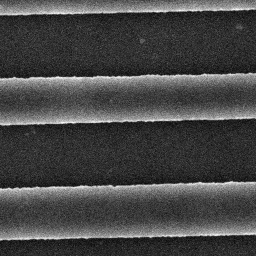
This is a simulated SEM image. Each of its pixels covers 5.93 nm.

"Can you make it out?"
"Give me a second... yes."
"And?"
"lines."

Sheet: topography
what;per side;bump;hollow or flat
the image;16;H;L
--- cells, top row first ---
HHHHHHHHHHHHHHHH
LLLLLLLLLLLLLLLL
LLLLLLLLLLLLLLLL
LLLLLLLLLLLLLLLL
LLLLLLLLLLLLLLLL
HHHHHHHHHHHHHHHH
HHHHHHHHHHHHHHHH
HHHHHHHHHHHHLLLL
LLLLLLLLLLLLLLLL
LLLLLLLLLLLLLLLL
LLLLLLLLLLLLLLLL
LLLLLLLLLLLHHHHH
HHHHHHHHHHHHHHHH
HHHHHHHHHHHHHHHH
HHHHHHHHHHHHHHHH
LLLLLLLLLLLLLLLL